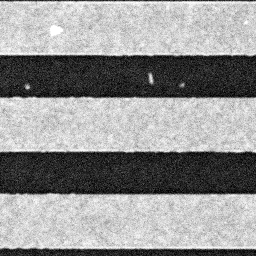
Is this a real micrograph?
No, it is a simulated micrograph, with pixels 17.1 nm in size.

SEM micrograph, lines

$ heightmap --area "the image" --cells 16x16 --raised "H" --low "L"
HHHHHHHHHHHHHHHH
HHHHHHHHHHHHHHHH
HHHHHHHHHHHHHHHH
LLLLLLLLLLLLLLLL
LLLLLLLLLLLLLLLL
LLLLLLLLLLLLLLLL
HHHHHHHHHHHHHHHH
HHHHHHHHHHHHHHHH
HHHHHHHHHHHHHHHH
LLLLLLLLLLLLLLLL
LLLLLLLLLLLLLLLL
LLLLLLLLLLLLLLLL
HHHHHHHHHHHHHHHH
HHHHHHHHHHHHHHHH
HHHHHHHHHHHHHHHH
LLLLLLLLLLLLLLLL